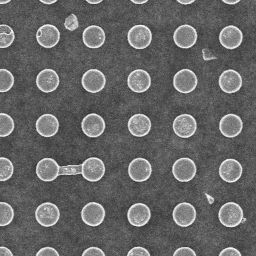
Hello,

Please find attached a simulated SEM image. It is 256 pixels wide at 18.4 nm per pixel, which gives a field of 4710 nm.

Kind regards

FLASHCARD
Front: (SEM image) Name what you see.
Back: a regular array of raised bodies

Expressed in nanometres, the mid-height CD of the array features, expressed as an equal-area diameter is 419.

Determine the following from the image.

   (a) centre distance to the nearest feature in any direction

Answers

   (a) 0.816 µm